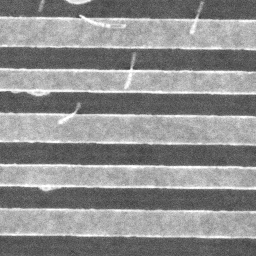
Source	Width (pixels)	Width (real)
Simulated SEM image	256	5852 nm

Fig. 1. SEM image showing lines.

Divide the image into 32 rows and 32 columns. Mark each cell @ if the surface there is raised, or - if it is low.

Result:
--------------------------------
--------------------------------
@@@@@@@@@@@@@@@@@@@@@@@@@-------
@@@@@@@@@@@@@@@@@@@@@@@@@@@@@@@@
@@@@@@@@@@@@@@@@@@@@@@@@@@@@@@@@
@@@@@@@@@@@@@@@@@@@@@@@@@@@@@@@@
--------------------------------
--------------------------------
--------------------------------
@@@@@@@@@@@@@@@@@@@@@@@@@@@@@@@@
@@@@@@@@@@@@@@@@@@@@@@@@@@@@@@@@
-------------------@@@@@@@@@@@@@
--------------------------------
--------------------------------
@@@@@@@@@@@@@@@@@@@@@@@@@-------
@@@@@@@@@@@@@@@@@@@@@@@@@@@@@@@@
@@@@@@@@@@@@@@@@@@@@@@@@@@@@@@@@
@@@@@@@@@@@@@@@@@@@@@@@@@@@@@@@@
--------------------------------
--------------------------------
--------------------------------
@@@@@@@@@@@@@@@@@@@@@@@@@@@@@@@@
@@@@@@@@@@@@@@@@@@@@@@@@@@@@@@@@
----------------------@@@@@@@@@@
--------------------------------
--------------------------------
@@@@@@@@@@@@@@@@@@@@@@@@@@@@@@@@
@@@@@@@@@@@@@@@@@@@@@@@@@@@@@@@@
@@@@@@@@@@@@@@@@@@@@@@@@@@@@@@@@
-----------------@@@@@@@@@@@@@@@
--------------------------------
--------------------------------